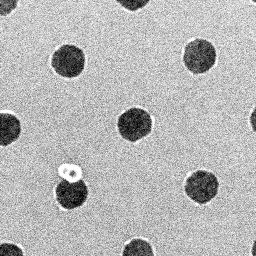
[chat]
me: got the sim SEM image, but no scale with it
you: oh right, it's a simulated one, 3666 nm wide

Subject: raised bodies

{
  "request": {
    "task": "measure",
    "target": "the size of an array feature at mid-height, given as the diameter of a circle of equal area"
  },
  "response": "521 nm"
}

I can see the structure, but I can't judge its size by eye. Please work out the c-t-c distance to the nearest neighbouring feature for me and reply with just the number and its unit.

1310 nm